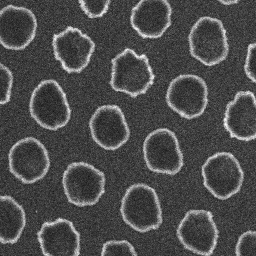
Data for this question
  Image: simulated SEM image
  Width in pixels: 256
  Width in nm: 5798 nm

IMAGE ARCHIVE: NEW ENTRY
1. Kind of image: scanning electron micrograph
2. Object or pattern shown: a regular array of raised bodies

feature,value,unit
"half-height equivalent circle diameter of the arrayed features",0.913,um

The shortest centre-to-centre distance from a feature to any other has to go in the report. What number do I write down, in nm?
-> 1330